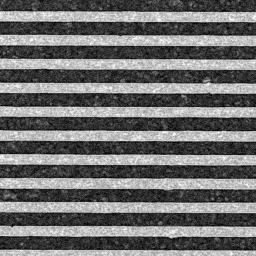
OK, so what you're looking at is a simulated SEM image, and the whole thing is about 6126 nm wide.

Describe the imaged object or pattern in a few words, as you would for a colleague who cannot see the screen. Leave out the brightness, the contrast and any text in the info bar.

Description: parallel lines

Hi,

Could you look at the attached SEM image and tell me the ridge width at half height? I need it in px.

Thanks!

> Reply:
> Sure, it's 9.5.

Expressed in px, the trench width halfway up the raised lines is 14.4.